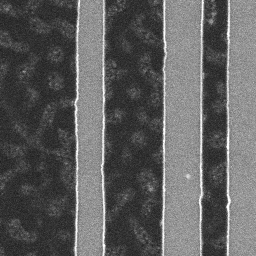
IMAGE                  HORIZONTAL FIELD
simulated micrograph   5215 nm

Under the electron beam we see one or a few lines or trenches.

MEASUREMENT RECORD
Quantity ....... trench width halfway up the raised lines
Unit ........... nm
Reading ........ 631